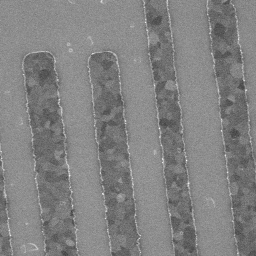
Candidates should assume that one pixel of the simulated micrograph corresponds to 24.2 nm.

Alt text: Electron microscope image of one or a few lines or trenches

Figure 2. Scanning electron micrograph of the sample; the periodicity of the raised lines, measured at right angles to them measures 1510 nm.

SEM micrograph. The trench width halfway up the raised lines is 807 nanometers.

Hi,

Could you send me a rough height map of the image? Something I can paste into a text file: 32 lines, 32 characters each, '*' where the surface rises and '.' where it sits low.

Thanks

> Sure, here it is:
..................***.....***...
..................***.....***...
..................***.....****..
..................***.....****..
..................***.....****..
...................***....****..
.....*.......*.....***....****..
...****....****....***.....***..
...****....****....***.....***..
...****....****....***.....***..
...****....****....***.....****.
...****.....***....***.....****.
...****.....***.....**.....****.
...*****....***.....***....****.
....****....****....***.....***.
....****....****....***.....***.
....****....****....***.....***.
....****....****....***.....***.
....****....****....***.....***.
....****....****....***.....****
....****.....***....***.....****
....*****....***....***.....****
*...*****....****....***.....***
*....****....****....***.....***
*....****....****....***.....***
*....****....****....***.....***
*....****....****....***.....***
*....****....****....***.....***
*....****....****....***.....***
*.....****....***.....***....***
*.....****....***.....***.....**
**....****....****....***.....**